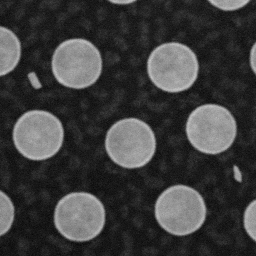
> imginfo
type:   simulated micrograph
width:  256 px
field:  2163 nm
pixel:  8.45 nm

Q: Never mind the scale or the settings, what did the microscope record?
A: raised bodies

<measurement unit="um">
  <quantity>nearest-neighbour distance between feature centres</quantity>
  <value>0.687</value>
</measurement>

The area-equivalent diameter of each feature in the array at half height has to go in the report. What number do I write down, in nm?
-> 406